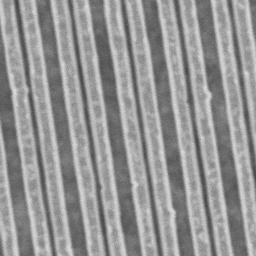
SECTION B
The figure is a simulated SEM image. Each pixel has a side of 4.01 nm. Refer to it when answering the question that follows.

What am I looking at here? parallel lines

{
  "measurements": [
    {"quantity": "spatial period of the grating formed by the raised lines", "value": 105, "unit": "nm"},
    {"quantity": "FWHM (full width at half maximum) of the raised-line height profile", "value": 52.1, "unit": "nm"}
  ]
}